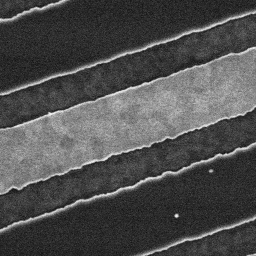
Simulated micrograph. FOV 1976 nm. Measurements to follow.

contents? lines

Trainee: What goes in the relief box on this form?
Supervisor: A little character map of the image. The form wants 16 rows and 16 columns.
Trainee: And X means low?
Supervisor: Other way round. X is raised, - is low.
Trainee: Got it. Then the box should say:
--XXXXXXXXXXXXXX
XXXXXXXXXXXXXX--
XXXXXXXXXXX-----
XXXXXXXX------XX
XXXXX------XXXXX
X-------XXXXXXXX
-----XXXXXXXXXXX
--XXXXXXXXXXXX--
XXXXXXXXXXX-----
XXXXXXXX------XX
XXXXX-------XXXX
XX-------XXXXXXX
-----XXXXXXXXXXX
--XXXXXXXXXXXXXX
XXXXXXXXXXXXX---
XXXXXXXXXX------